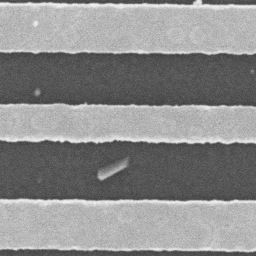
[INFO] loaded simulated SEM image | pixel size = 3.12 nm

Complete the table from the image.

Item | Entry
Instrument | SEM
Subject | lines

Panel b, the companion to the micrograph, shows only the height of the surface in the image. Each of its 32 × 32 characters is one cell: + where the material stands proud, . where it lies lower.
+++++++....+....................
++++++++++++++++++++++++++++++++
++++++++++++++++++++++++++++++++
++++++++++++++++++++++++++++++++
++++++++++++++++++++++++++++++++
++++++++++++++++++++++++++++++++
++..+.+.++.+++++++++++++++++++++
................................
................................
................................
................................
................................
................................
++++++++++++++++++++++++++++++++
++++++++++++++++++++++++++++++++
++++++++++++++++++++++++++++++++
++++++++++++++++++++++++++++++++
+++++.++++++++.+++++++++++++++++
................................
................................
................................
.............+..................
................................
................................
................................
++++++++++++++++++++++++++++++++
++++++++++++++++++++++++++++++++
++++++++++++++++++++++++++++++++
++++++++++++++++++++++++++++++++
++++++++++++++++++++++++++++++++
++++++++++++++++++++++++++++++++
................................